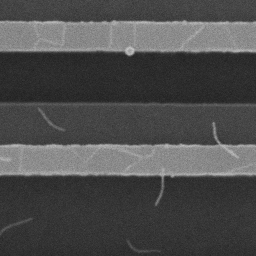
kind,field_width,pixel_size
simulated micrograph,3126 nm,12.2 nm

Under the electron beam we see lines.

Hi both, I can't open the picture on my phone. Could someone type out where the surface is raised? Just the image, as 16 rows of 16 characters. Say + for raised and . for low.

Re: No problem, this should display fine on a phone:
++++++++++++++++
++++++++++++++++
++++++++++++++++
................
................
................
................
++++++++++++++++
++++++++++++++++
++++++++++++++++
++++++++++++++++
................
................
................
................
................